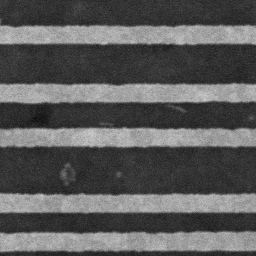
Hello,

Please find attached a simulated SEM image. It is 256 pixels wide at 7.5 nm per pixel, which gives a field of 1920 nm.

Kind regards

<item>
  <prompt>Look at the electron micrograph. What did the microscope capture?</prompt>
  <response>lines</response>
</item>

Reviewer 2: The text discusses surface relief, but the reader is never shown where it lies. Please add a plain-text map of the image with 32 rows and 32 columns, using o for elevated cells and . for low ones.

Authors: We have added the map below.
................................
................................
................................
oooooooooooooooooooooooooooooooo
oooooooooooooooooooooooooooooooo
................................
................................
................................
................................
................................
................................
oooooooooooooooooooooooooooooooo
oooooooooooooooooooooooooooooooo
................................
................................
................................
oooooooooooooooooooooooooooooooo
oooooooooooooooooooooooooooooooo
................................
................................
................................
........o.......................
................................
................................
oooooooooooooo.ooooooooooooooooo
oooooooooooooooooooooooooooooooo
..........o.....................
................................
................................
oooooooooooooooooooooooooooooooo
oooooooooooooooooooooooooooooooo
................................